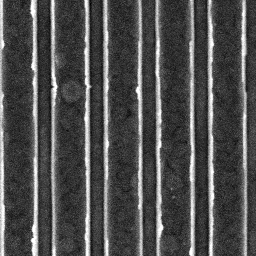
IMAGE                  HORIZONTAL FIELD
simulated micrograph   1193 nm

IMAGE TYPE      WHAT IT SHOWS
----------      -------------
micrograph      parallel lines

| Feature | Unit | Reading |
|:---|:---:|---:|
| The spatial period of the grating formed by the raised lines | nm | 244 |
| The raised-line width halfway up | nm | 171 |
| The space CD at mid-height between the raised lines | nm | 74.6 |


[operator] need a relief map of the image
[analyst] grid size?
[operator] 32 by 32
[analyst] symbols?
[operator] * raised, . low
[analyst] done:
****...****..****...****..*****.
****...****..*****..****..*****.
****...****..*****..****..*****.
****...****..*****..****..*****.
****...****..*****..****..*****.
****...****..*****..****..*****.
****...****..*****..****..*****.
****...****..*****..****..*****.
*****..****..*****.*****..*****.
*****..****..*****..****..*****.
*****..****..*****..****..*****.
****...****..*****..****..*****.
****...****..*****..****..*****.
****...****..*****..****..*****.
****...****..*****..****..*****.
****...****..*****..****..*****.
****...****..*****..****..*****.
****...****..*****..****..*****.
****...****..*****..****..*****.
****...****..*****..****..*****.
****...****..*****..****..*****.
*****..****..*****..****..*****.
****...****..*****..****..*****.
*****..****..*****..****..*****.
*****..****..*****..****..*****.
*****..****..*****..****..*****.
*****..****..*****..****..*****.
*****..****..*****..****..*****.
*****..****..*****..****..*****.
*****..****..*****..****..*****.
*****..****..*****..****..*****.
*****..****..*****..****..*****.